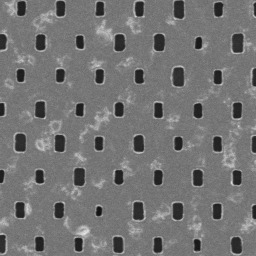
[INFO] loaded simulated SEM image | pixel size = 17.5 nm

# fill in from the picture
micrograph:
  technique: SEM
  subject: a regular array of holes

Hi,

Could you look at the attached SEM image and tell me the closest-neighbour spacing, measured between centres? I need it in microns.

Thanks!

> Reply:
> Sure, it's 0.678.